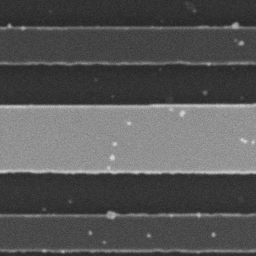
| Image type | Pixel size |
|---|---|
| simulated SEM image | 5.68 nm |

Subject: lines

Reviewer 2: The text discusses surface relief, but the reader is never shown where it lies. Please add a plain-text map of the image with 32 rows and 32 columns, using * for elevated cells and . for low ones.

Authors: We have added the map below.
................................
................................
................................
********************************
********************************
********************************
********************************
********************************
................................
................................
................................
................................
................................
********************************
********************************
********************************
********************************
********************************
********************************
********************************
********************************
*...****************************
................................
................................
................................
................................
................................
********************************
********************************
********************************
********************************
.......*................*.......